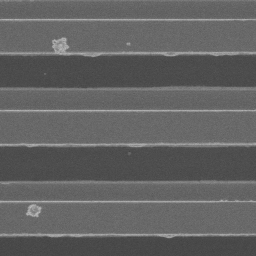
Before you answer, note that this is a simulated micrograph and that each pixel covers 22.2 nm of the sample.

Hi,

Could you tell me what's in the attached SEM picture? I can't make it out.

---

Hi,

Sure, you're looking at lines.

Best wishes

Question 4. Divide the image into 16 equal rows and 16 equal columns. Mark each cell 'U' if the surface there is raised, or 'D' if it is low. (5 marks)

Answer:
UUUUUUUUUUUUUUUU
UUUUUUUUUUUUUUUU
UUUUUUUUUUUUUUUU
DDDDDDDDDDDDDDDD
DDDDDDDDDDDDDDDD
DDDDDDDDDDDDDDDD
UUUUUUUUUUUUUUUU
UUUUUUUUUUUUUUUU
UUUUUUUUUUUUUUUU
DDDDDDDDDDDDDDDD
DDDDDDDDDDDDDDDD
UUUUUUUUUUUUUUUU
UUUUUUUUUUUUUUUU
UUUUUUUUUUUUUUUU
UUUUUUUUUUUUUUUU
DDDDDDDDDDDDDDDD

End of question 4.